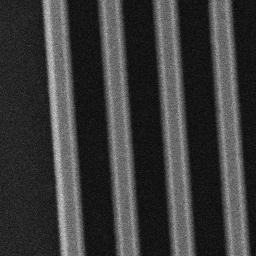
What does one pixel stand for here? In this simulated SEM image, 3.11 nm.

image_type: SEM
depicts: parallel lines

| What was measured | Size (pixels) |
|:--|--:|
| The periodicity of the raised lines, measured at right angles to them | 54.9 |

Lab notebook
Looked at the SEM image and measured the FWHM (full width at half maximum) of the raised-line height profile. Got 55 nanometres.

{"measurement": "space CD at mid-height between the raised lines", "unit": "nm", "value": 113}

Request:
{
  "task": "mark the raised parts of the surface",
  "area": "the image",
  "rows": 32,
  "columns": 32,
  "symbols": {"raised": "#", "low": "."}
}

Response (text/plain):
......##.....##.....##....###...
......##.....##.....##....###...
......##.....##.....##.....##...
......##.....##.....##.....##...
......##.....##.....##.....##...
......##.....##.....##.....##...
......##.....##.....##.....##...
......##.....##.....##.....##...
......###....##.....##.....##...
......###....###....##.....##...
.......##....###....###....##...
.......##.....##....###....##...
.......##.....##....###....##...
.......##.....##....###....###..
.......##.....##.....##....###..
.......##.....##.....##.....##..
.......##.....##.....##.....##..
.......##.....##.....##.....##..
.......##.....##.....##.....##..
.......##.....##.....##.....##..
.......##.....##.....##.....##..
.......##.....##.....##.....##..
.......###....##.....##.....##..
.......###....###....##.....##..
........##....###....###....##..
........##.....##....###....##..
........##.....##....###....##..
........##.....##....###....###.
........##.....##.....##....###.
........##.....##.....##.....##.
........##.....##.....##.....##.
........##.....##.....##.....##.